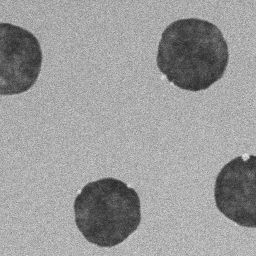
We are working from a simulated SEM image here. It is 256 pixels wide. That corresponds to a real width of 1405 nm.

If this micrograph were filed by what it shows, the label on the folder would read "holes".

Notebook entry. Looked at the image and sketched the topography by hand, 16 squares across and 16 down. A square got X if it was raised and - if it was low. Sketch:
XXXXXXXXXXXXXXXX
-XXXXXXXXXX--XXX
--XXXXXXXX----XX
---XXXXXXX----XX
--XXXXXXXX----XX
--XXXXXXXXX--XXX
XXXXXXXXXXXXXXXX
XXXXXXXXXXXXXXXX
XXXXXXXXXXXXXXXX
XXXXXXXXXXXXXXXX
XXXXXXXXXXXXXX--
XXXXXX--XXXXX---
XXXXX----XXXX---
XXXXX----XXXXX--
XXXXX---XXXXXXXX
XXXXXXXXXXXXXXXX